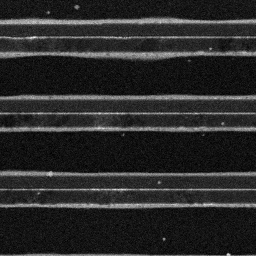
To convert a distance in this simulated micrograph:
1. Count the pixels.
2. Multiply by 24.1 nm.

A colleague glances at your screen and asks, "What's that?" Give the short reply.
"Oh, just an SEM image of lines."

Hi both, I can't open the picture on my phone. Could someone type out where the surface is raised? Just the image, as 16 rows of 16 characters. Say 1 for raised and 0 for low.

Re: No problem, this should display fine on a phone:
0000000000000000
1111111111111111
1111111111111111
0000000000000000
0000000000000000
0000000000000000
1111111111111111
1111111111111111
0000000000000000
0000000000000000
0000000000000000
1111111111111111
1111111111111111
0000000000000000
0000000000000000
0000000000000000